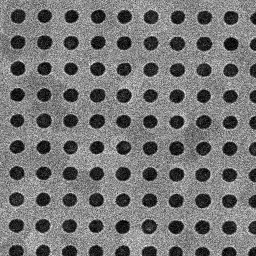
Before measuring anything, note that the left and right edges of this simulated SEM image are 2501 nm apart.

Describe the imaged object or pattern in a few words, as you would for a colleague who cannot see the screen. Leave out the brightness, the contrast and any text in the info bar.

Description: a regular array of holes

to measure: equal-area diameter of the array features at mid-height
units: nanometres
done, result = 148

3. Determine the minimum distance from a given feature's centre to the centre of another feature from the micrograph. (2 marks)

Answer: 255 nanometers